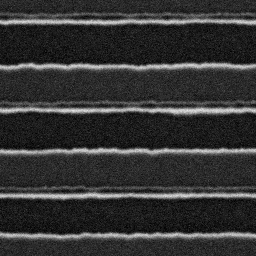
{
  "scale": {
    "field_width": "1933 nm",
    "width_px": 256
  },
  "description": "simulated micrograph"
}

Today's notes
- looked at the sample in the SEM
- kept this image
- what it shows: lines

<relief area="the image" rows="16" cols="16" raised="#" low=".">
################
................
................
................
################
################
################
................
................
################
################
################
................
................
................
################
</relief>